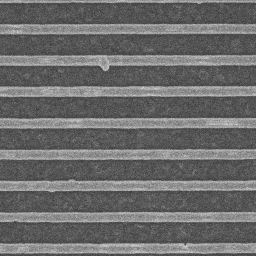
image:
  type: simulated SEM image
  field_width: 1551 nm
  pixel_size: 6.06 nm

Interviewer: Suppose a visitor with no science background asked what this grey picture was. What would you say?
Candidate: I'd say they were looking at parallel lines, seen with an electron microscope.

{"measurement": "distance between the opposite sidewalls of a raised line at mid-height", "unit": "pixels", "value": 9.37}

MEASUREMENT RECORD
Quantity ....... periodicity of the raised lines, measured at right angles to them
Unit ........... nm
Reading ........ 190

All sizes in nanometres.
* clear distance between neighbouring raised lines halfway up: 130